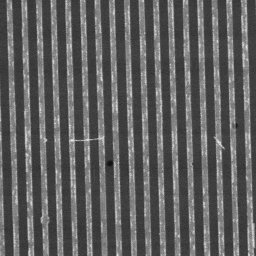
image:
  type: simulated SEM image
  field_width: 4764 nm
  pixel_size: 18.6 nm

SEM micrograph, parallel lines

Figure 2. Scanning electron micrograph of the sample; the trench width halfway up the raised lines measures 179 nm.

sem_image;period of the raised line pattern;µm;0.273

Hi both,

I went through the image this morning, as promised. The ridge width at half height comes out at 97.6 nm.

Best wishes